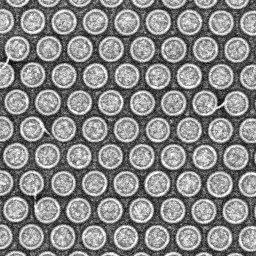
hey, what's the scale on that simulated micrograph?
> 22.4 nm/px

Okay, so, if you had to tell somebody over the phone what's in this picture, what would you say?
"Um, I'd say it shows a regular array of raised bodies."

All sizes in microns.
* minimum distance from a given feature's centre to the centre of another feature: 0.69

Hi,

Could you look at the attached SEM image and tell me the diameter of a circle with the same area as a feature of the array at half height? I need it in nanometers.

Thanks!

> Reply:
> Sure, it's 528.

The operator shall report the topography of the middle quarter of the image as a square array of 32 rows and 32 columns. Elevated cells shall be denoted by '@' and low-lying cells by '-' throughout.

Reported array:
@@-----@@-----@@@-----@@@-----@@
@@@--@@@@@---@@@@@---@@@@@---@@@
@@@--@@@@@@--@@@@@---@@@@@---@@@
@@@--@@@@@@--@@@@@---@@@@@---@@@
@@---@@@@@---@@@@@---@@@@@---@@@
@-----@@@-----@@@-----@@@-----@@
--------------------------------
--@@@@----@@@@----@@@-----@@@---
-@@@@@---@@@@@---@@@@@---@@@@@--
-@@@@@@--@@@@@@--@@@@@---@@@@@--
-@@@@@@--@@@@@---@@@@@---@@@@@--
--@@@@---@@@@@---@@@@@---@@@@@--
----@------@@------@------@@----
-------@@-----------------------
@@----@@@@----@@@@----@@@@---@@@
@@@--@@@@@---@@@@@---@@@@@---@@@
@@@--@@@@@---@@@@@---@@@@@--@@@@
@@---@@@@@---@@@@@---@@@@@---@@@
@@----@@@@----@@@@---@@@@@---@@@
--------------------------------
---@@------@-------@@-----@@----
-@@@@@---@@@@@---@@@@@---@@@@@--
-@@@@@---@@@@@---@@@@@---@@@@@--
-@@@@@---@@@@@---@@@@@--@@@@@@--
-@@@@@---@@@@@---@@@@@---@@@@@--
--@@@-----@@@-----@@@----@@@@---
--------------------------------
@-----@@@-----@@@-----@@@-----@@
@@---@@@@@---@@@@@---@@@@@---@@@
@@@--@@@@@@--@@@@@--@@@@@@--@@@@
@@@--@@@@@@--@@@@@--@@@@@@--@@@@
@@---@@@@@---@@@@@---@@@@@---@@@